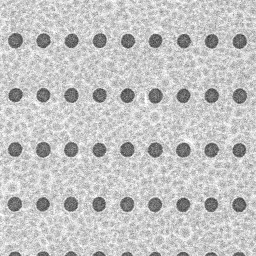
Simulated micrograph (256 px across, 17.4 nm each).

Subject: a regular array of holes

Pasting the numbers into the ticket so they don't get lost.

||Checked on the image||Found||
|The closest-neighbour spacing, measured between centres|0.486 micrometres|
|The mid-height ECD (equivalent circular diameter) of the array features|267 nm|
